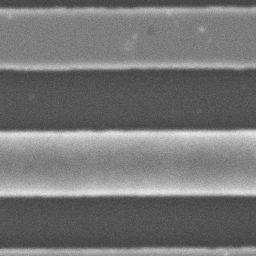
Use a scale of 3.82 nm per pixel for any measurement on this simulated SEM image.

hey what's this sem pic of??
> lines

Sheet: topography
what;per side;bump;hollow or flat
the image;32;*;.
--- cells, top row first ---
................................
********************************
********************************
********************************
********************************
********************************
********************************
********************************
****************.............*..
................................
................................
................................
................................
................................
................................
................................
.............**.***.************
********************************
********************************
********************************
********************************
********************************
********************************
********************************
................................
................................
................................
................................
................................
................................
................................
********************************